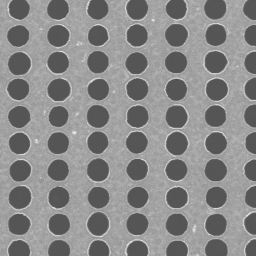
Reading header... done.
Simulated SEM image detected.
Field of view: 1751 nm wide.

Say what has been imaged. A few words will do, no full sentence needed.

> a regular array of holes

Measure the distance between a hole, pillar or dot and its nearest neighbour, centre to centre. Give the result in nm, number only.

183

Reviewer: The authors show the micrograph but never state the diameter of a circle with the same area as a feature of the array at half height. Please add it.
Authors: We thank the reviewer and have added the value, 148 nm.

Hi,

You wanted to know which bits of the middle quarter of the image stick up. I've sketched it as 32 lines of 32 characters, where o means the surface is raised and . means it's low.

.ooooo.....ooooo.....oooo......o
ooooooo...oooooo....oooooo....oo
oooooooooooooooooooooooooooooooo
oooooooooooooooooooooooooooooooo
.oooooo....ooooo....oooooo....oo
.ooooo.....ooooo.....ooooo.....o
..oooo.....ooooo.....oooo......o
.ooooo.....ooooo.....ooooo.....o
.oooooo...ooooooo...oooooo....oo
oooooooooooooooooooooooooooooooo
ooooooo..oooooooo...ooooooo..ooo
.ooooo.....ooooo.....ooooo....oo
.ooooo.....ooooo.....ooooo.....o
.ooooo.....ooooo.....oooo......o
.ooooo.....ooooo.....ooooo.....o
ooooooo...ooooooo...ooooooo...oo
oooooooooooooooooooooooooooooooo
ooooooo...ooooooo...ooooooo...oo
.ooooo.....ooooo.....ooooo.....o
.ooooo.....oooo......ooooo.....o
.ooooo.....ooooo.....ooooo.....o
.oooooo...oooooo....oooooo....oo
oooooooo.oooooooooooooooooo...oo
oooooooooooooooooooooooooooooooo
ooooooo....oooooo...ooooooo...oo
.ooooo.....ooooo.....ooooo.....o
.ooooo.....ooooo.....oooo......o
.ooooo.....ooooo.....ooooo.....o
ooooooo....oooooo...oooooo....oo
oooooooooooooooooooooooooooooooo
oooooooooooooooooooooooooooooooo
.oooooo...ooooooo...oooooo....oo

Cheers